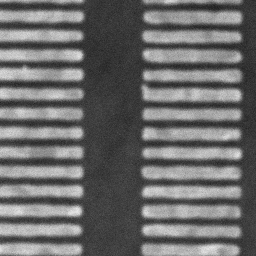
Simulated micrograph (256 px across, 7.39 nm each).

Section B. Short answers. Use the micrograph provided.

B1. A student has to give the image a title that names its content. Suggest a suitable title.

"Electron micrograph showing wiring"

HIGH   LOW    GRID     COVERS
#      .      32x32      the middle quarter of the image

................................
................................
####................############
####................############
................................
................................
.###................############
####................############
####................############
................................
................................
####.................######.....
####................############
####................############
................................
................................
####................############
####................############
....................############
................................
................................
####................############
####................############
................................
................................
................................
####................############
####................############
...........................#####
................................
................................
####................############